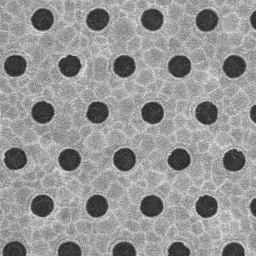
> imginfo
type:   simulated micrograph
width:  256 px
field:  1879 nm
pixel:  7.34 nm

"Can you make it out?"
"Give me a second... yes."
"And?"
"a regular array of holes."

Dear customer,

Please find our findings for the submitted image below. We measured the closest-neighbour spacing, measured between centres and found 394 nm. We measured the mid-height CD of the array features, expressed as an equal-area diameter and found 0.171 um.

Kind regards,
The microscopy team